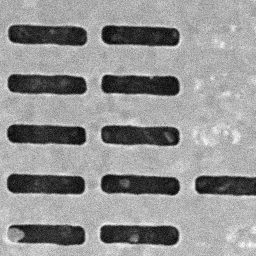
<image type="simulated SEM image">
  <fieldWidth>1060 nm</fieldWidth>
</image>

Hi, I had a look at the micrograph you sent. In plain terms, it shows a regular array of holes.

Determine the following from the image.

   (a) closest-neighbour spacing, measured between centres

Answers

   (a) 0.205 um